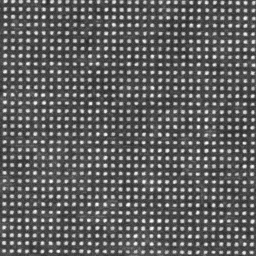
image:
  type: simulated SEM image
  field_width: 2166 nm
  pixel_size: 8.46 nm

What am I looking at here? a regular array of raised bodies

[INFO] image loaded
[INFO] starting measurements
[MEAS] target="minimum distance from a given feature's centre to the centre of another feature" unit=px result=7.17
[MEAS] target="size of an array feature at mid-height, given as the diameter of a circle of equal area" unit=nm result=27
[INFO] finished